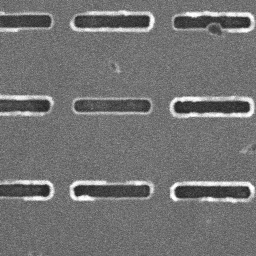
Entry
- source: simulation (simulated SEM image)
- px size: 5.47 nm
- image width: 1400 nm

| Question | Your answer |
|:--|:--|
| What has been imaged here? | holes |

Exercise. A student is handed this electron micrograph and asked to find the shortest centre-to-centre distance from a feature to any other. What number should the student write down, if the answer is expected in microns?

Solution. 0.465